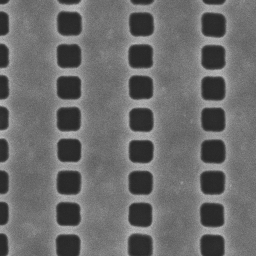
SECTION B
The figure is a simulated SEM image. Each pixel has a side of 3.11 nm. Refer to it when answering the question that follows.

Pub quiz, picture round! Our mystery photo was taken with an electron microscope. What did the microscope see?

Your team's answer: a regular array of holes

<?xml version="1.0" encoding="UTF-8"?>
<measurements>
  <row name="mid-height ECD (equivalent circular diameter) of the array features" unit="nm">75.8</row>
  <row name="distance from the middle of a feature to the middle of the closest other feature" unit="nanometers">97.4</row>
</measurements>